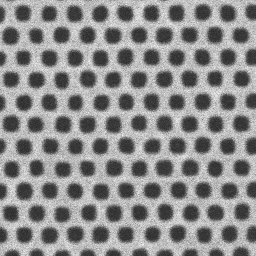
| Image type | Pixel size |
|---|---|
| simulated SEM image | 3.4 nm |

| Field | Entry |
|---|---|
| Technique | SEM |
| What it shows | a regular array of holes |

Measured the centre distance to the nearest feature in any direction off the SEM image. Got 24.8 px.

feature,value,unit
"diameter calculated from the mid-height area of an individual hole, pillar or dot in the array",16.7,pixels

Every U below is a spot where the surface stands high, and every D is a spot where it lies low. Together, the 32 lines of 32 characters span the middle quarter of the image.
UDDDUUUUDDUUUUUDUUUUUUUUUUUUUUUU
UUUUUUUUUUUUUUUUUUUUUUUUUUUUUUUU
DUUUDDDDUUUDDDUUUDDDUUUDDDDUUDDD
DUUUDDDDUUDDDDUUUDDDDUUDDDDUUDDD
DUUUDDDDUUDDDDUUUDDDDUUDDDDUUDDD
DUUUUDDUUUUDDDUUUDDDUUUUDDDUUUDD
UUUUUUUUUUUUUUUUUUUUUUUUUUUUUUUU
UUUUUUUUUUUUUUUDUUUUUDDUUUUUUUUU
UDDDUUUUDDDUUUDDDUUUDDDDUUDDDDUU
UDDDDUUDDDDUUUDDDDUUDDDDUUDDDDUU
UDDDDUUDDDDUUUDDDUUUDDDDUUDDDDUU
UUDDUUUUDDUUUUUDUUUUUDDUUUUUDUUU
UUUUUUUUUUUUUUUUUUUUUUUUUUUUUUUU
DUUUDDDDUUUDDDUUUDDDDUUDDDDUUUDD
DDUUDDDDUUUDDDUUUDDDDUUDDDDUUDDD
DDUUDDDDUUDDDDUUUDDDDUUDDDDUUDDD
DDUUDDDDUUUDDDUUUDDDUUUDDDDUUUDD
UUUUUUUUUUUUUUUUUUUUUUUUUUUUUUUU
UUUUUUUUUUUUUUUDUUUUUUUUUUUDDUUU
UDDDDUUDDDDUUUDDDUUUDDDDUUDDDDUU
UDDDDUUDDDDUUUDDDDUUDDDDUUDDDDDU
UDDDDUUDDDDUUUDDDUUUDDDDUUDDDDUU
UUDDUUUUDDUUUUUUUUUUUDDUUUUUDUUU
UUUUUUUUUUUUUUUUUUUUUUUUUUUUUUUU
DUUUDDDUUUUDDDUUUUDDUUUUDDDUUUDD
DDUUDDDDUUDDDDDUUDDDDUUDDDDUUUDD
DDUUDDDDUUDDDDDUUDDDDUUDDDDUUDDD
DDUUDDDDUUUDDDUUUDDDDUUUDDDUUUDD
UUUUUUUUUUUUUUUUUUUUUUUUUUUUUUUU
UUUUUUUUUUUUUUUUUUUUUUUUUUUUDUUU
UDDDUUUDDDDUUUDDDUUUDDDDUUUDDDUU
UDDDDUUDDDDUUUDDDDUUDDDDUUDDDDDU